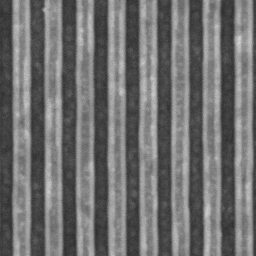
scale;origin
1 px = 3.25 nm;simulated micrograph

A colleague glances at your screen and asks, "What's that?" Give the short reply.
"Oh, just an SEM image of parallel lines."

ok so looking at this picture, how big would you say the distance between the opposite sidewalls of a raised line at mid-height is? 13.9 pixels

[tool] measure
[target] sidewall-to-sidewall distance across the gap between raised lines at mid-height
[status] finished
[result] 59.3 nm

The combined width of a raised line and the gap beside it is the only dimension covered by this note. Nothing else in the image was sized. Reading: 103 nm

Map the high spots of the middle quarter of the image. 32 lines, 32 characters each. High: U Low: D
DDDDUUUDDDDDUUUDDDDDUUUDDDDDUUUD
DDDDUUUDDDDDUUUDDDDDUUUDDDDDUUUD
DDDDUUUDDDDDUUUDDDDDUUUDDDDDUUUD
DDDDUUUDDDDDUUUDDDDDUUUDDDDDUUUD
DDDDUUUDDDDDUUUDDDDDUUUDDDDDUUUD
DDDDUUUDDDDDUUUDDDDDUUUDDDDDUUUD
DDDDUUUDDDDDUUUDDDDDUUUDDDDDUUUD
DDDDUUUDDDDDUUUDDDDDUUUDDDDDUUUD
DDDDUUUDDDDDUUUDDDDDUUUDDDDDUUUD
DDDDUUUDDDDDUUUDDDDDUUUDDDDDUUUD
DDDDUUUDDDDDUUUDDDDDUUUDDDDDUUUD
DDDDUUUDDDDDUUUDDDDDUUUDDDDDUUUD
DDDDUUUDDDDDUUUDDDDDUUUDDDDDUUUD
DDDDUUUDDDDDUUUDDDDDUUUDDDDDUUUD
DDDDUUUDDDDDUUUDDDDDUUUDDDDDUUUD
DDDDUUUDDDDDUUUDDDDDUUUDDDDDUUDD
DDDDUUUDDDDDUUUDDDDDUUUDDDDDUUDD
DDDDUUUDDDDDUUUDDDDDUUUDDDDDUUDD
DDDDUUUDDDDDUUUDDDDDUUUDDDDDUUUD
DDDDUUUDDDDDUUUDDDDDUUUDDDDDUUUD
DDDDUUUDDDDDUUUDDDDDUUUDDDDDUUUD
DDDDUUUDDDDDUUUDDDDDUUUDDDDDUUUD
DDDDUUUDDDDDUUUDDDDDUUUDDDDUUUUD
DDDDUUUDDDDDUUUDDDDDUUUDDDDUUUUD
DDDDUUUDDDDDUUUDDDDDUUUDDDDDUUUD
DDDDUUUDDDDDUUUDDDDDUUUDDDDUUUUD
DDDDUUUDDDDDUUUDDDDDUUUDDDDUUUUD
DDDDUUUDDDDDUUUDDDDDUUUDDDDUUUUD
DDDDUUUDDDDDUUUDDDDDUUUDDDDUUUUD
DDDDUUUDDDDDUUUDDDDDUUUDDDDUUUDD
DDDDUUUDDDDDUUUDDDDDUUUDDDDDUUDD
DDDDUUUDDDDDUUUDDDDDUUUDDDDUUUDD